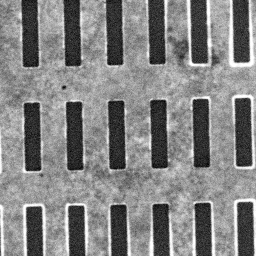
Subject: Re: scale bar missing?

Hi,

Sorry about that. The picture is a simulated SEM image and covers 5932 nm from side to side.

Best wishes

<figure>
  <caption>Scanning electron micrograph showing groups of lines, slits or small figures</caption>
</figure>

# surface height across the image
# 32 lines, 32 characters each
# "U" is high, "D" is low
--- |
UUUDDUUUDDUUUDDUUUDDDUUUDDUUUDDU
UUUDDUUUDDUUUDDUUUDDDUUUDDUUUDDU
UUUDDUUUDDUUUDDUUUDDDUUUDDUUUDDU
UUUDDUUUDDUUUDDUUUUDDUUUDDUUUDDU
UUUDDUUUDDUUUDDUUUUDDUUUDDUUUDDU
UUUDDUUUDDUUUDDUUUUDDUUUDDUUUDDU
UUUDDUUUDDUUUDDDUUUDDUUUDDUUUDDU
UUUDDUUUDDUUUDDDUUUDDUUUDDUUUDDU
UUUDUUUUUUUUUUUUUUUUUUUUUUUUUUUU
UUUUUUUUUUUUUUUUUUUUUUUUUUUUUUUU
UUUUUUUUUUUUUUUUUUUUUUUUUUUUUUUU
UUUUUUUUUUUUUUUUUUUUUUUUUUUUUUUU
UUUUUUUUUUUUUUDUUUUDDUUUDDUUUDDU
UUUDDUUUDDUUUDDDUUUDDUUUDDUUUDDD
UUUDDUUUDDUUUDDDUUUDDUUUDDUUUDDD
UUUDDUUUDDUUUDDDUUUDDUUUDDUUUDDD
UUUDDUUUDDUUUDDDUUUDDUUUDDUUUDDD
UUUDDUUUDDDUUDDDUUUDDUUUDDUUUDDD
UUUDDUUUDDDUUDDDUUUDDUUUDDUUUDDD
UUUDDUUUDDDUUUDDUUUDDUUUDDUUUDDD
UUUDDUUUDDDUUUDDUUUDDUUUDDUUUDDD
UUUUUUUUUUUUUUUUUUUUUUUUUUUUUUUU
UUUUUUUUUUUUUUUUUUUUUUUUUUUUUUUU
UUUUUUUUUUUUUUUUUUUUUUUUUUUUUUUU
UUUUUUUUUUUUUUUUUUUUUUUUUUUUUUUU
UUUUUUUUUUUUUUUUUUUUDUUUUDUUUDDD
UUUDDUUUDDDUUUDDUUUDDUUUDDDUUDDD
UUUDDUUUDDDUUUDDUUUDDUUUDDDUUDDD
UUUDDDUUDDDUUUDDUUUDDUUUDDDUUDDD
UUUDDDUUDDDUUUDDUUUDDUUUDDDUUDDD
UUUDDDUUDDDUUUDDUUUDDUUUDDDUUDDD
UUUDDDUUUDDUUUDDUUUDDUUUDDDUUDDD